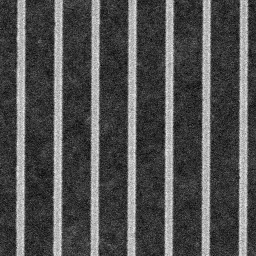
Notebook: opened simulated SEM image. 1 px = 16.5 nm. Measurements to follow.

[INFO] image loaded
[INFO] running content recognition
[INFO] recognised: parallel lines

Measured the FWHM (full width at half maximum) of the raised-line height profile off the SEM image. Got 119 nm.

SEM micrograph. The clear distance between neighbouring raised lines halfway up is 498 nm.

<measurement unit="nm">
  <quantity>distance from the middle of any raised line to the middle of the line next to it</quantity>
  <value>611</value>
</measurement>